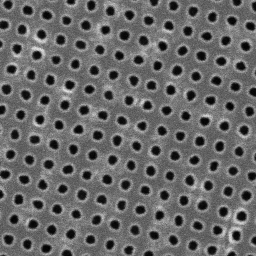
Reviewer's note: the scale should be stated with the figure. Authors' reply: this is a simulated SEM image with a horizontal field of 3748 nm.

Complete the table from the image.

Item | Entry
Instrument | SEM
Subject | a regular array of holes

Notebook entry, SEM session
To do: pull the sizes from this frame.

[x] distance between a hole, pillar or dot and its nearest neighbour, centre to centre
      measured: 289 nanometres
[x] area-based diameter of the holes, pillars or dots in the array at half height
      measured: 0.144 micrometres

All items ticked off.